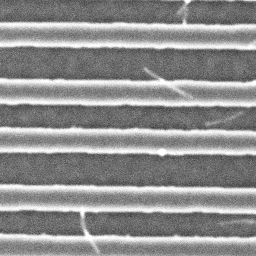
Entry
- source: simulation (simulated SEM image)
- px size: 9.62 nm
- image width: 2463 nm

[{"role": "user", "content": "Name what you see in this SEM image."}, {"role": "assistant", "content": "lines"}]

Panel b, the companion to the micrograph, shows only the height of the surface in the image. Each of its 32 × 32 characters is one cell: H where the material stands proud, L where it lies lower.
LLLLLLLLLLLLLLLLLLLLLLLLLLLLLLLL
LLLLLLLLLLLLLLLLLLLLLLLLLLLLLLLL
LLLLLLLLLLLLLLLLLLLLLLLLLLLLLLLL
HHHHHHHHHHHHHHHHHHHHHHHHHHHHHHHH
HHHHHHHHHHHHHHHHHHHHHHHHHHHHHHHH
HHHHHHHHHHHHHHHHHHHHHHHHHHHHHHHH
LLLLLLLLLLLLLLLLLLLLLLLLLLLLLLLL
LLLLLLLLLLLLLLLLLLLLLLLLLLLLLLLL
LLLLLLLLLLLLLLLLLLLLLLLLLLLLLLLL
LLLLLLLLLLLLLLLLLLLLLLLLLLLLLLLL
HHHHHHHHHHHHHHHHHHHHHHHHHHHHHHHH
HHHHHHHHHHHHHHHHHHHHHHHHHHHHHHHH
HHHHHHHHHHHHHHHHHHHHHHHHHHHHHHHH
LLLLLLLLLLLLLLLLLLLLLLLLLLLLLLLL
LLLLLLLLLLLLLLLLLLLLLLLLLLLLLLLL
LLLLLLLLLLLLLLLLLLLLLLLLLLLLLLLL
HHHHHHHHHHHHHHHHHHHHHHHHHHHHHHHH
HHHHHHHHHHHHHHHHHHHHHHHHHHHHHHHH
HHHHHHHHHHHHHHHHHHHHHHHHHHHHHHHH
LLLLLLLLLLLLLLLLLLLLLLLLLLLLLLLL
LLLLLLLLLLLLLLLLLLLLLLLLLLLLLLLL
LLLLLLLLLLLLLLLLLLLLLLLLLLLLLLLL
LLLLLLLLLLLLLLLLLLLLLLLLLLLLLLLL
HHHHHHHHHHHHHHHHHLHHHHLLLLLLLLLL
HHHHHHHHHHHHHHHHHHHHHHHHHHHHHHHH
HHHHHHHHHHHHHHHHHHHHHHHHHHHHHHHH
LLLLLLLLLLHLLLLLLLLLLLLLLLLHHHHH
LLLLLLLLLLLLLLLLLLLLLLLLLLLLLLLL
LLLLLLLLLLLLLLLLLLLLLLLLLLLLLLLL
HHHHLLLLLLHLLLLLLLLLLLLLLLLLLLLL
HHHHHHHHHHHHHHHHHHHHHHHHHHHHHHHH
HHHHHHHHHHHHHHHHHHHHHHHHHHHHHHHH